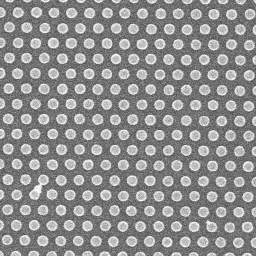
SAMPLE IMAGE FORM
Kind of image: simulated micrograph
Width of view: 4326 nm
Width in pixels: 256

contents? a regular array of raised bodies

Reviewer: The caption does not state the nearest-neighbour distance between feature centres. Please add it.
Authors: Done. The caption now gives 17.3 pixels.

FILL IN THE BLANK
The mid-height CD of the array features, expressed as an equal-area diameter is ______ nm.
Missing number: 167